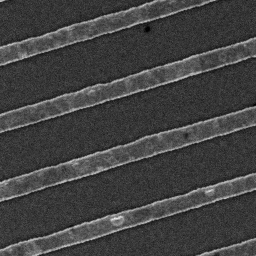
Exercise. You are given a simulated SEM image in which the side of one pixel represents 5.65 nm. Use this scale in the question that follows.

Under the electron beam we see lines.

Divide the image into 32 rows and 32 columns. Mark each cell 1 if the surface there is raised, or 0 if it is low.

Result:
00000000000000000001111111000000
00000000000000001111110000000000
00000000000011111110000000000000
00000000111111110000000000000000
00000011111100000000000000000000
00111111100000000000000000000011
11111100000000000000000000111111
11000000000000000000000111111100
00000000000000000000111111100000
00000000000000000111111100000000
00000000000000111111100000000000
00000000001111111000000000000000
00000001111111000000000000000000
00011111110000000000000000000001
11111110000000000000000000001111
11110000000000000000000011111111
00000000000000000000011111111000
00000000000000000111111111000000
00000000000000111111110000000000
00000000000111111110000000000000
00000000111111100000000000000000
00001111111100000000000000000000
01111111100000000000000000000111
11111000000000000000000000111111
11000000000000000000000111111000
00000000000000000001111111000000
00000000000000011111110000000000
00000000000011111110000000000000
00000000011111110000000000000000
00000011111110000000000000000000
00111111100000000000000000000011
11111100000000000000000000111111